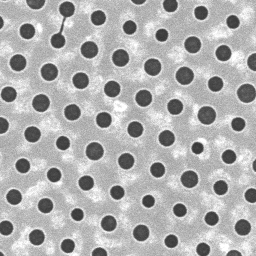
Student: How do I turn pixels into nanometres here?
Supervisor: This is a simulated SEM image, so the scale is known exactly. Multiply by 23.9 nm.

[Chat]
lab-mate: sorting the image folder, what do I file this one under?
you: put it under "a regular array of holes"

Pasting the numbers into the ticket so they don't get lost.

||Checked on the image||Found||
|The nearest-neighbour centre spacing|770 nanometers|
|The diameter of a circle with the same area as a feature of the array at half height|397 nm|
